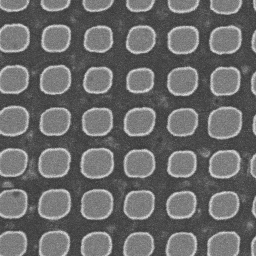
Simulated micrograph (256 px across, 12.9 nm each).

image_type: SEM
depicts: a regular array of raised bodies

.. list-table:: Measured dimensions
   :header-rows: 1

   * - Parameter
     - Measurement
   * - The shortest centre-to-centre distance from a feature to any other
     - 530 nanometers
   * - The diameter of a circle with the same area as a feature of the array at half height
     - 376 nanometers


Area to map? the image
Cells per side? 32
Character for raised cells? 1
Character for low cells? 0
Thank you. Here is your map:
11100111001111001110011110111100
00000000000000000000000000011000
00000000000000000000000000000000
11100011000010000110001100011000
11110111100111001110011110111100
11100111100111001110011110111100
00000000000000000100001100011000
00000000000000000000000000000000
01100011000000000000001000000000
11100111100111001110011110011100
11100111100111001110011110111100
11000011000100000100001100011000
00000000000000000000000000000000
01100000000000000000000000000000
11100111101111001110011110111100
11100111101111001110011100111100
11100011000110001110011100111100
00000000000000000000000000000000
00000000000000000000000000000000
11100111101111001110011100011100
11100111101111001110011100111101
11100111001111001110011100111001
00000000000000000000000000000000
00000000000000000000000000000000
11100111101111001110011100011100
11100111101111001110011100111100
11100111001111001110011100111100
00000000000000000000000000000000
00000000000000000000000000000000
11100111000111001110001100011100
11100111101111001110011100111100
11100111001111001110011100111101